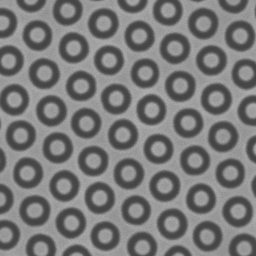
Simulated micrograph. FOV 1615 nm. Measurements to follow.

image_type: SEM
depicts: a regular array of ring-shaped grooves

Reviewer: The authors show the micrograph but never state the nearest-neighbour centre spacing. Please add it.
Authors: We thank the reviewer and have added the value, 235 nanometers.